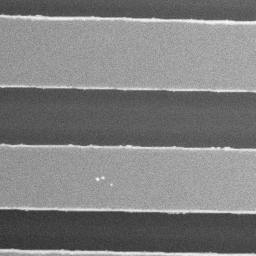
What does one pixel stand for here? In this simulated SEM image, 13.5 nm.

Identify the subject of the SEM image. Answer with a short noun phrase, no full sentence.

lines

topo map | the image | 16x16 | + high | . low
................
++++++++++++++++
++++++++++++++++
++++++++++++++++
++++++++++++++++
.....+++++++++++
................
................
................
++++++++++++++++
++++++++++++++++
++++++++++++++++
++++++++++++++++
................
................
................